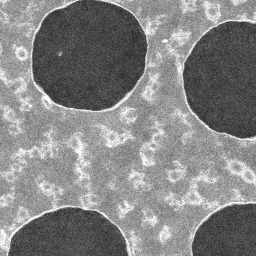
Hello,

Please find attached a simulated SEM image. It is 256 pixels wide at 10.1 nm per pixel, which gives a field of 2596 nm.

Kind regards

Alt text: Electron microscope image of holes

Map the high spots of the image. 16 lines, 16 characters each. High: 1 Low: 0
1111000011111111
1110000001111100
1100000001110000
1100000001110000
1100000001100000
1100000011110000
1111000111110000
1111111111111000
1111111111111110
1111111111111111
1111111111111111
1111111111111111
1111111111111111
1100001111111000
1000000011110000
1000000011110000